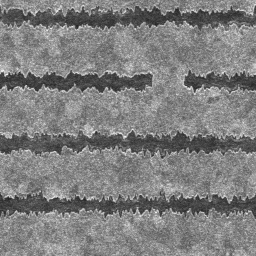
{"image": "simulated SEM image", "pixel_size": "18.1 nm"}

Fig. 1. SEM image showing one or a few lines or trenches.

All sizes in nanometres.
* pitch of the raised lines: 1120